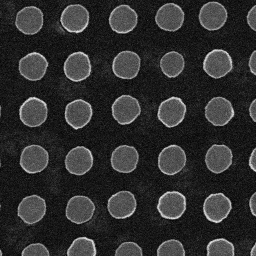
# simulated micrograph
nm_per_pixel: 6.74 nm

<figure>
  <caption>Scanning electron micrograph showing a regular array of raised bodies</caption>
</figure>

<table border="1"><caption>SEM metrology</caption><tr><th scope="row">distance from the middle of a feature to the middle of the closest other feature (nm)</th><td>303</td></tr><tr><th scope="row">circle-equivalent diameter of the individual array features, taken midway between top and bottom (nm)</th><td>190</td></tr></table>